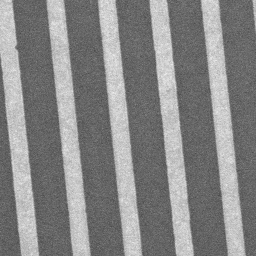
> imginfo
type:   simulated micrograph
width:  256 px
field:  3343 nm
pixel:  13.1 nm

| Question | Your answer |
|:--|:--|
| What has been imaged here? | parallel lines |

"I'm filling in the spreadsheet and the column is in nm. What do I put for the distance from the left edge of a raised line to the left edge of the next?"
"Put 670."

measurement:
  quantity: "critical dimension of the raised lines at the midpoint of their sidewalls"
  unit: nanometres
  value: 218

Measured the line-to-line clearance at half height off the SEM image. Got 448 nm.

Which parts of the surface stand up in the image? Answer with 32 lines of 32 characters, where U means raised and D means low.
UUDDDDUUDDDDUUDDDDDUUDDDDUUDDDDD
UUDDDDUUDDDDUUUDDDDUUDDDDUUDDDDD
UUDDDDUUDDDDUUUDDDDUUDDDDUUDDDDD
UUDDDDUUDDDDDUUDDDDUUDDDDDUUDDDD
UUDDDDUUDDDDDUUDDDDUUDDDDDUUDDDD
UUDDDDUUUDDDDUUDDDDUUDDDDDUUDDDD
UUDDDDDUUDDDDUUDDDDUUDDDDDUUDDDD
UUDDDDDUUDDDDUUDDDDDUUDDDDUUDDDD
UUDDDDDUUDDDDUUDDDDDUUDDDDUUDDDD
UUDDDDDUUDDDDUUDDDDDUUDDDDUUDDDD
UUUDDDDUUDDDDUUDDDDDUUDDDDUUDDDD
DUUDDDDUUDDDDDUUDDDDUUDDDDUUDDDD
DUUDDDDUUDDDDDUUDDDDUUDDDDUUUDDD
DUUDDDDUUDDDDDUUDDDDUUDDDDDUUDDD
DUUDDDDUUDDDDDUUDDDDUUDDDDDUUDDD
DUUDDDDUUDDDDDUUDDDDUUDDDDDUUDDD
DUUDDDDDUUDDDDUUDDDDUUUDDDDUUDDD
DUUDDDDDUUDDDDUUDDDDDUUDDDDUUDDD
DUUDDDDDUUDDDDUUDDDDDUUDDDDUUDDD
DUUDDDDDUUDDDDUUDDDDDUUDDDDUUDDD
DDUUDDDDUUDDDDUUDDDDDUUDDDDUUDDD
DDUUDDDDUUDDDDDUUDDDDUUDDDDUUDDD
DDUUDDDDUUDDDDDUUDDDDUUDDDDDUUDD
DDUUDDDDUUDDDDDUUDDDDUUDDDDDUUDD
DDUUDDDDUUDDDDDUUDDDDUUDDDDDUUDD
DDUUDDDDDUUDDDDUUDDDDUUDDDDDUUDD
DDUUDDDDDUUDDDDUUDDDDDUUDDDDUUDD
DDUUDDDDDUUDDDDUUDDDDDUUDDDDUUDD
DDUUDDDDDUUDDDDUUDDDDDUUDDDDUUDD
DDUUUDDDDUUDDDDUUDDDDDUUDDDDUUDD
DDDUUDDDDUUDDDDDUUDDDDUUDDDDUUDD
DDDUUDDDDUUDDDDDUUDDDDUUDDDDDUUD